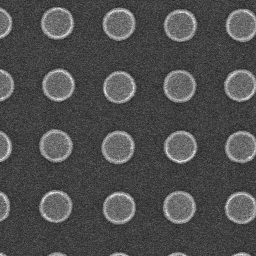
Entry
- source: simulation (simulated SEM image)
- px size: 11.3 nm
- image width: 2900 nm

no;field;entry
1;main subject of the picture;a regular array of raised bodies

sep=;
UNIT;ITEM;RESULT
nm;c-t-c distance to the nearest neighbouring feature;686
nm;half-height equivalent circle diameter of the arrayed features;348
